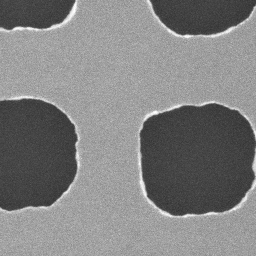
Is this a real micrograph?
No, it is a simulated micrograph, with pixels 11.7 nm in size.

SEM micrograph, holes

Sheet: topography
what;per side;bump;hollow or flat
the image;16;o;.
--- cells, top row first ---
.....ooooo......
....oooooo.....o
oooooooooooooooo
oooooooooooooooo
oooooooooooooooo
oooooooooooooooo
...oooooooooo.oo
....ooooo......o
.....oooo.......
.....oooo.......
.....oooo.......
....ooooo.......
....ooooo......o
oooooooooooooooo
oooooooooooooooo
oooooooooooooooo